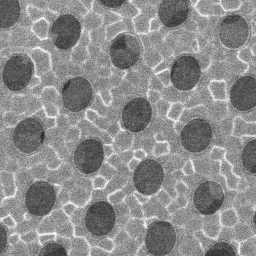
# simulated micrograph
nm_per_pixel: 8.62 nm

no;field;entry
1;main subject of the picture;a regular array of raised bodies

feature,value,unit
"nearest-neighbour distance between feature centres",544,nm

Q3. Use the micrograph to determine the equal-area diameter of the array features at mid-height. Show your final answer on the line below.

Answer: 34.2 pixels